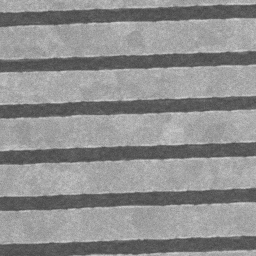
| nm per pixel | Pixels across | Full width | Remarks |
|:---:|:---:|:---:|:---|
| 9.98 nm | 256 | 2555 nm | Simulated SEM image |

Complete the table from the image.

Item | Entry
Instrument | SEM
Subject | lines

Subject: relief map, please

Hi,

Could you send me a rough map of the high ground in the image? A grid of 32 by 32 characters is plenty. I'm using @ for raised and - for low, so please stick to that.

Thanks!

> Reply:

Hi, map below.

@@@@@@@@@@@@@@@@@@@@@@@@@@@@----
--------------------------------
----------------------------@@@@
@@@@@@@@@@@@@@@@@@@@@@@@@@@@@@@@
@@@@@@@@@@@@@@@@@@@@@@@@@@@@@@@@
@@@@@@@@@@@@@@@@@@@@@@@@@@@@@@@@
@@@@@@@@@@@@@@@@@@@@@@@@@-------
--------------------------------
------------------------@@@@@@@@
@@@@@@@@@@@@@@@@@@@@@@@@@@@@@@@@
@@@@@@@@@@@@@@@@@@@@@@@@@@@@@@@@
@@@@@@@@@@@@@@@@@@@@@@@@@@@@@@@@
@@@@@@@@@@@@@@@-----------------
--------------------------------
--------------@@@@@@@@@@@@@@@@@@
@@@@@@@@@@@@@@@@@@@@@@@@@@@@@@@@
@@@@@@@@@@@@@@@@@@@@@@@@@@@@@@@@
@@@@@@@@@@@@@@@@@@@@@@@@@@@@@@@@
@@@@@@@-------------------------
--------------------------------
----@@@@@@@@@@@@@@@@@@@@@@@@@@@@
@@@@@@@@@@@@@@@@@@@@@@@@@@@@@@@@
@@@@@@@@@@@@@@@@@@@@@@@@@@@@@@@@
@@@@@@@@@@@@@@@@@@@@@@@@@@@@@---
@-------------------------------
-----------------------------@@@
@@@@@@@@@@@@@@@@@@@@@@@@@@@@@@@@
@@@@@@@@@@@@@@@@@@@@@@@@@@@@@@@@
@@@@@@@@@@@@@@@@@@@@@@@@@@@@@@@@
@@@@@@@@@@@@@@@@@@@@@@@@@@@-----
--------------------------------
----------------------------@@@@